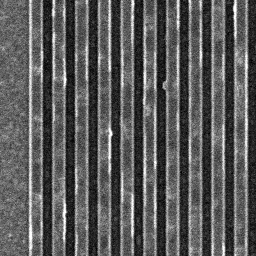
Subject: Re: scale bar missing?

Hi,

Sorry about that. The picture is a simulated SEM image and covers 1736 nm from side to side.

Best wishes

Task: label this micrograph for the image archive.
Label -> parallel lines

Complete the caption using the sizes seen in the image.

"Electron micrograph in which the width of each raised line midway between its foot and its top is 0.083 um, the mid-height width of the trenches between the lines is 71.2 nm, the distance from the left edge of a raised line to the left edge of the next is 154 nm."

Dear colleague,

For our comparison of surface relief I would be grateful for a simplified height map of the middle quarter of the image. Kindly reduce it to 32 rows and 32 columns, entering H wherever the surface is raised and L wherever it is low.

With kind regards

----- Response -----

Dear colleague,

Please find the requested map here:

LLLHHHLLLHHHLLHHHLLLHHHLLLHHHLLL
LLLHHHLLLHHHLLHHHLLLHHHLLLHHHLLH
LLLHHHLLLHHHLLHHHLLLHHHLLLHHHLLH
HLLHHHLLLHHHLLHHHLLLHHHLLLHHHLLL
HLLHHHLLLHHHLLHHHLLLHHHLLHHHHLLL
LLLHHHLLLHHHLLHHHLLLHHHLLHHHHLLL
LLLHHHLLLHHHLLHHHLLLHHHLLHHHHLLL
LLLHHHLLLHHHLLHHHLLLHHHLLLHHHLLL
LLLHHHLLLHHHLLHHHLLLHHHLLLHHHLLL
LLLHHHLLLHHHLLHHHLLLHHHLLLHHHLLL
LLLHHHLLLHHHLLHHHLLLHHHLLLHHHLLL
LLLHHHLLLHHHLLHHHLLLHHHLLLHHHLLL
LLLHHHLLLHHHLLHHHLLLHHHLLLHHHLLL
LLLHHHLLLHHHLLHHHLLLHHHLLLHHHLLH
LLLHHHLLLHHHLLHHHLLLHHHLLLHHHLLH
LLLHHHLLLHHHLLHHHLLLHHHLLLHHHLLH
LLLHHHLLLHHHLLHHHLLLHHHLLLHHHLLH
LLLHHHLLLHHHLLHHHLLLHHHLLLHHHLLH
LLLHHHLLLHHHLLHHHLLLHHHLLLHHHLLH
LLLHHHLLLHHHLLHHHLLLHHHLLLHHHLLH
LLLHHHLLLHHHLLHHHLLLHHHLLLHHHLLH
LLLHHHLLLHHHLLHHHLLLHHHLLLHHHLLH
LLLHHHLLLHHHLLHHHLLLHHHLLLHHHLLH
LLLHHHLLLHHHLLHHHLLLHHHLLLHHHLLH
LLLHHHLLLHHHLLHHHLLLHHHLLLHHHLLH
LLLHHHLLLHHHLLHHHLLLHHHLLLHHHLLH
LLLHHHLLLHHHLLHHHLLLHHHLLLHHHLLH
LLLHHHLLLHHHLLHHHLLLHHHLLLHHHLLH
LLLHHHLLLHHHLLHHHLLLHHHLLLHHHLLH
LLLHHHLLLHHHLLHHHLLLHHHLLLHHHLLH
LLLHHHLLLHHHLLHHHLLLHHHLLLHHHLLH
LLLHHHLLLHHHLLHHHLLLHHHLLLHHHLLH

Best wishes